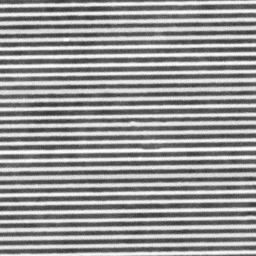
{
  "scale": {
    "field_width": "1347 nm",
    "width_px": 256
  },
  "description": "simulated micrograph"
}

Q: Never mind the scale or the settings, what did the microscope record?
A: parallel lines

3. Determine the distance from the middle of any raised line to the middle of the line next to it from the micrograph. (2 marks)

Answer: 0.0453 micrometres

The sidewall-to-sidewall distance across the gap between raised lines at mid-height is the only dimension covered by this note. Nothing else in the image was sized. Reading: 0.0322 um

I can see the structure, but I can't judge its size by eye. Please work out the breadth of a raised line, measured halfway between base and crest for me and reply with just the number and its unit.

13.8 nanometres